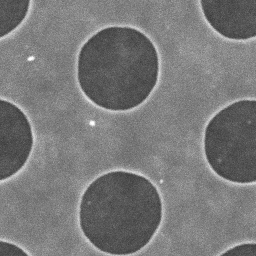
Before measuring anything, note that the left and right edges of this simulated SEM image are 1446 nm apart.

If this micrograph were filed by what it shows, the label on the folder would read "holes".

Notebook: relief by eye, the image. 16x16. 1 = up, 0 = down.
0011111111111000
0111111111111000
1111110001111111
1111100000111111
1111100000111111
1111100000111111
0111110001111110
0011111111111000
0011111111111000
0011111111111000
0111111111111000
1111110001111111
1111100000111111
1111100000111111
1111100000111111
0111110001111110